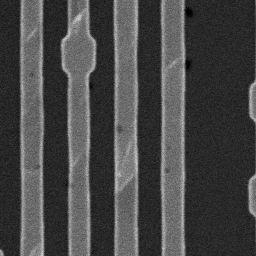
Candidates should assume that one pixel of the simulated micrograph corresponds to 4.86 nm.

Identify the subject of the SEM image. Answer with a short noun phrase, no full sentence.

wiring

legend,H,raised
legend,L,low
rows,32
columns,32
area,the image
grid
LLLHHLLLLHHLLLHHHLLLHHHLLLLLLLLL
LLLHHLLLLHHLLLHHHLLLHHHLLLLLLLLL
LLLHHLLLLHHLLLHHHLLLHHHLLLLLLLLL
LLLHHLLLLHHLLLHHHLLLHHHLLLLLLLLL
LLLHHLLLHHHLLLHHHLLLHHHLLLLLLLLL
LLLHHLLLHHHHLLHHHLLLHHHLLLLLLLLL
LLLHHLLLHHHHLLHHHLLLHHHLLLLLLLLL
LLLHHLLLHHHHLLHHHLLLHHHLLLLLLLLL
LLLHHLLLHHHHLLHHHLLLHHHLLLLLLLLL
LLLHHLLLLHHLLLHHHLLLHHHLLLLLLLLL
LLLHHLLLLHHLLLHHHLLLHHHLLLLLLLLL
LLLHHLLLLHHLLLHHHLLLHHHLLLLLLLLH
LLLHHLLLLHHLLLHHHLLLHHHLLLLLLLLH
LLLHHLLLLHHLLLHHHLLLHHHLLLLLLLLH
LLLHHLLLLHHLLLHHHLLLHHHLLLLLLLLH
LLLHHLLLLHHLLLHHHLLLHHHLLLLLLLLL
LLLHHLLLLHHLLLHHHLLLHHHLLLLLLLLL
LLLHHLLLLHHLLLHHHLLLHHHLLLLLLLLL
LLLHHLLLLHHLLLHHHLLLHHHLLLLLLLLL
LLLHHLLLLHHLLLHHHLLLHHHLLLLLLLLL
LLLHHLLLLHHLLLHHHLLLHHHLLLLLLLLL
LLLHHLLLLHHLLLHHHLLLHHHLLLLLLLLL
LLLHHLLLLHHLLLHHHLLLHHHLLLLLLLLH
LLLHHLLLLHHLLLHHHLLLHHHLLLLLLLLH
LLLHHLLLLHHLLLHHHLLLHHHLLLLLLLLH
LLLHHLLLLHHLLLHHHLLLHHHLLLLLLLLH
LLLHHLLLLHHLLLHHHLLLHHHLLLLLLLLH
LLLHHLLLLHHLLLHHHLLLHHHLLLLLLLLL
LLLHHLLLLHHLLLHHHLLLHHHLLLLLLLLL
LLLHHLLLLHHLLLHHHLLLHHHLLLLLLLLL
LLLHHLLLLHHLLLHHHLLLHHHLLLLLLLLL
LLLHHLLLLHHLLLHHHLLLHHHLLLLLLLLL